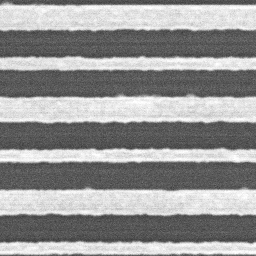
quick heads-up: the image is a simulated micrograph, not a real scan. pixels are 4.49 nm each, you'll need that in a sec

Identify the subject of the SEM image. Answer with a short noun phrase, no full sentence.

lines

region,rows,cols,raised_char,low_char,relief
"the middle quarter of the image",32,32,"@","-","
@@@@@@@@@@@@@@@@@@@@@@@@@@@@@@@@
--------------------------------
--------------------------------
--------------------------------
--------------------------------
--------------------------------
--------------------------------
--------------------------------
@@@@@-----@@--@@@@@@@@@-@@-@@@-@
@@@@@@@@@@@@@@@@@@@@@@@@@@@@@@@@
@@@@@@@@@@@@@@@@@@@@@@@@@@@@@@@@
@@@@@@@@@@@@@@@@@@@@@@@@@@@@@@@@
@@@@@@@@@@@@@@@@@@@@@@@@@@@@@@@@
@@@@@@@@@@@@@@@@@@@@@@@@@@@@@@@@
@@-------@-----@----------------
--------------------------------
--------------------------------
--------------------------------
--------------------------------
--------------------------------
--------------------------------
------------@-@------@---@------
@@@@@@@@@@@@@@@@@@@@@@@@@@@@@@@@
@@@@@@@@@@@@@@@@@@@@@@@@@@@@@@@@
--------------------------------
--------------------------------
--------------------------------
--------------------------------
--------------------------------
--------------------------------
--------------------------------
--------------------------------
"